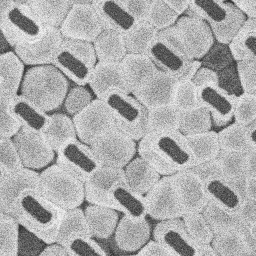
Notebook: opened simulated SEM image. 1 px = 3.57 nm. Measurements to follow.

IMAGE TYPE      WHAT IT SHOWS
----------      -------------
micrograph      a regular array of holes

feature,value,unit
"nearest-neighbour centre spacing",165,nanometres